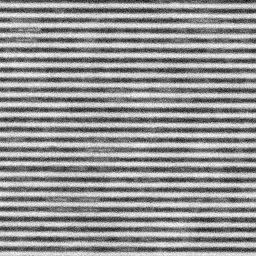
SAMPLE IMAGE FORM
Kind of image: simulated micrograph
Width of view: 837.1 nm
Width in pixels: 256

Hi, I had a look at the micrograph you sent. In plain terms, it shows parallel lines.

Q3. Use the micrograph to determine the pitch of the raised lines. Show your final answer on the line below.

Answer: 32.5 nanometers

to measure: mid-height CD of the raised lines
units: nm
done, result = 11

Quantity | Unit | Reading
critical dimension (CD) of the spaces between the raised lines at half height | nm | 19.2